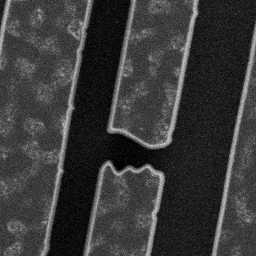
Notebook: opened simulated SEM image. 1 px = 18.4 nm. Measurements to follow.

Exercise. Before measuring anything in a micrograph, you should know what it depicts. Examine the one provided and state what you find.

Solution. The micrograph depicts one or a few lines or trenches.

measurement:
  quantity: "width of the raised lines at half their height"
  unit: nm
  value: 1140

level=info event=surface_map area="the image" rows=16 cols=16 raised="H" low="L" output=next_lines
HHHHHHLLHHHHLLLL
HHHHHLLLHHHHLLLL
HHHHHLLLHHHHLLLL
HHHHHLLLHHHHLLLL
HHHHHLLHHHHLLLLL
HHHHHLLHHHHLLLLH
HHHHLLLHHHHLLLLH
HHHHLLLHHHHLLLLH
HHHHLLLLHHHLLLLH
HHHHLLLLLLLLLLLH
HHHHLLLLLLLLLLHH
HHHHLLHHHHLLLLHH
HHHLLLHHHHLLLLHH
HHHLLLHHHHLLLLHH
HHHLLLHHHHLLLLHH
HHHLLHHHHLLLLHHH